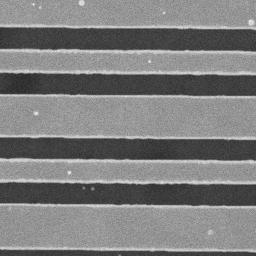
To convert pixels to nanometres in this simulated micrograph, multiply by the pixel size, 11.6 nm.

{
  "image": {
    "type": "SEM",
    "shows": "lines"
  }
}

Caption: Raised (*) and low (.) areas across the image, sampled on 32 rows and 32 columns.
********************************
********************************
********************************
......................**********
................................
................................
*******************************.
********************************
********************************
................................
................................
................................
********************************
********************************
********************************
********************************
********************************
................................
................................
................................
********************************
********************************
********************************
................................
................................
................................
********************************
********************************
********************************
********************************
********************************
................................